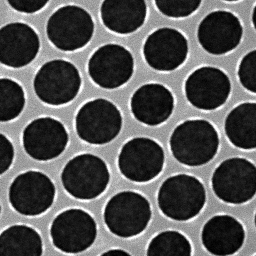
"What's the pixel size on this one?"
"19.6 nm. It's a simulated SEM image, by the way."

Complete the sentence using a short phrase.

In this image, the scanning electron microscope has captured a regular array of holes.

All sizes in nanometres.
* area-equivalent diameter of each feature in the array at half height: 909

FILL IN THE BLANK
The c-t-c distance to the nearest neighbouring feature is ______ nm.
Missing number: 1100